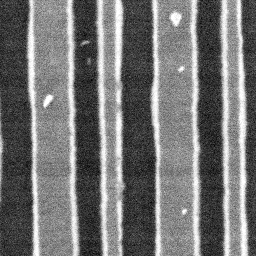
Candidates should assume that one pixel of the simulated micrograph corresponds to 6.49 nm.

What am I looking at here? lines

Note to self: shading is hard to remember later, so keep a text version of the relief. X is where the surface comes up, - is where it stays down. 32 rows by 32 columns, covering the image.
----XXXXX----XX----XXXXX----XX--
----XXXXX----XX----XXXXX----XX--
----XXXXX----XX----XXXXX----XX--
----XXXXX----XX----XXXXX----XX--
----XXXXX----XX----XXXXX----XX--
----XXXXX----XX----XXXXX----XX--
----XXXXX----XX----XXXXX----XX--
----XXXXX----XX----XXXXX----XX--
----XXXXX----XX----XXXXX----XX--
----XXXXX----XX-----XXXX----XX--
----XXXXX----XX----XXXXX----XX--
----XXXXX----XX----XXXXX----XX--
----XXXXX----XX----XXXXX----XX--
----XXXXX----XX----XXXXX----XX--
----XXXXX----XX----XXXXX----XX--
----XXXXX----XX-----XXXX----XX--
----XXXXX----XX-----XXXX----XX--
----XXXXX----XX-----XXXX----XX--
----XXXXX----XX-----XXXX----XX--
----XXXXX----XX-----XXXX----XX--
----XXXXX----XX-----XXXX----XX--
----XXXXX----XX-----XXXX----XX--
----XXXXX----XX-----XXXX----XX--
----XXXXX----XX-----XXXX----XX--
----XXXXX----XX-----XXXX----XX--
----XXXXX----XX-----XXXX----XX--
----XXXXX----XX-----XXXX----XX--
----XXXXX----XX-----XXXX----XX--
----XXXXX----XX-----XXXX----XX--
----XXXXX----XX-----XXXX----XX--
-----XXXX----XX-----XXXXX---XX--
-----XXXX----XX-----XXXXX---XXX-